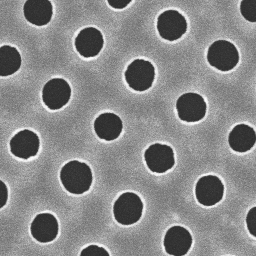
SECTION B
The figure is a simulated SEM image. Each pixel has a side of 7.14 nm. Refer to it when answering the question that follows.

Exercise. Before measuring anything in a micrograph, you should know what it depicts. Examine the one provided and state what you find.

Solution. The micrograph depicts a regular array of holes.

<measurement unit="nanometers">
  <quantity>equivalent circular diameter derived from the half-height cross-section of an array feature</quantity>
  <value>217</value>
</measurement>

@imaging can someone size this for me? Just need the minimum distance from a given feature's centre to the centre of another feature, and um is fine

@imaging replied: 0.426